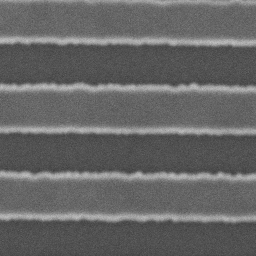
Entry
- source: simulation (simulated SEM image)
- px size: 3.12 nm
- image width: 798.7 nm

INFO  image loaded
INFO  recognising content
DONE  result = lines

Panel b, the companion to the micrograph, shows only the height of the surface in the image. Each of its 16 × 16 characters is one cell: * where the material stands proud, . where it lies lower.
****************
****************
****************
................
................
****************
****************
****************
................
................
................
****************
****************
****************
................
................